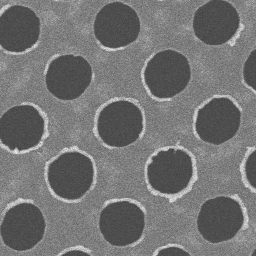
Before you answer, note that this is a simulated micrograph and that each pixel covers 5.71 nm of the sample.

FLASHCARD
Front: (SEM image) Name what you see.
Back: a regular array of holes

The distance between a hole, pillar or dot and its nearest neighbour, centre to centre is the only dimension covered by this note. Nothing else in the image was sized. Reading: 0.396 microns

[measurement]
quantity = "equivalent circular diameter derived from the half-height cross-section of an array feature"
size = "264 nanometres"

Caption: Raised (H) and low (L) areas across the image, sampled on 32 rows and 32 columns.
HHHHHHHHHHHHHHLLHHHHHHHHHHLLLHHH
HLLLHHHHHHHHLLLLLHHHHHHHLLLLLLHH
LLLLLHHHHHHHLLLLLHHHHHHHLLLLLLHH
LLLLLHHHHHHHLLLLLLHHHHHHLLLLLLHH
LLLLLHHHHHHHLLLLLHHHHHHHHLLLLHHH
LLLLHHHHHHHHHLLLHHHHHHHHHHLLHHHH
HHLHHHHHHHHHHHHHHHHHLLHHHHHHHHHH
HHHHHHHLLLLHHHHHHHHLLLLHHHHHHHHL
HHHHHHLLLLLHHHHHHHLLLLLLHHHHHHLL
HHHHHHLLLLLHHHHHHHLLLLLLHHHHHHLL
HHHHHHLLLLLHHHHHHHLLLLLHHHHHHHHL
HHHHHHLLLLHHHHHHHHHLLLLHHHHHHHHH
HHHHHHHHLHHHHHHHHHHHHHHHHHLLLHHH
HLLLHHHHHHHHHLLLLHHHHHHHHLLLLLHH
LLLLLHHHHHHHLLLLLLHHHHHHHLLLLLHH
LLLLLHHHHHHHLLLLLLHHHHHHLLLLLLHH
LLLLLHHHHHHHLLLLLLHHHHHHHLLLLLHH
LLLLLHHHHHHHHLLLLHHHHHHHHLLLLHHH
HLLLHHHHHHHHHHHHHHHHHHHHHHHHHHHH
HHHHHHHLLLLHHHHHHHHLLLLLHHHHHHHL
HHHHHHLLLLLHHHHHHHHLLLLLHHHHHHHL
HHHHHHLLLLLLHHHHHHLLLLLLHHHHHHHL
HHHHHHLLLLLLHHHHHHHLLLLLHHHHHHHL
HHHHHHLLLLLHHHHHHHHLLLLHHHHHHHHH
HHHHHHHLLLHHHHHHHHHHHHHHHHHHHHHH
HHLLHHHHHHHHHHLLLHHHHHHHHLLLLLHH
HLLLLHHHHHHHHLLLLLHHHHHHHLLLLLHH
LLLLLLHHHHHHLLLLLLHHHHHHHLLLLLHH
LLLLLLHHHHHHLLLLLLHHHHHHHLLLLLHH
LLLLLHHHHHHHHLLLLLHHHHHHHLLLLHHH
HLLLLHHHHHHHHHLLHHHHHHHHHHHHHHHH
HHHHHHHHHLHHHHHHHHHHLLLHHHHHHHHH